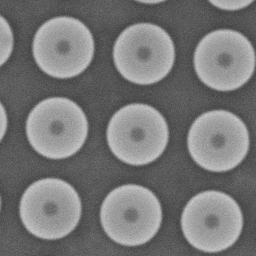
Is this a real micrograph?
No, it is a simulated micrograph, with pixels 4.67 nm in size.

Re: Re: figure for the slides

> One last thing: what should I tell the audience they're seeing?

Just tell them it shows an array of small figures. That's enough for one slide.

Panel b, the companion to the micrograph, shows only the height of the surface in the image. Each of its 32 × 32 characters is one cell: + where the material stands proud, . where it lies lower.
...........................++++.
................................
+.....++++......................
+....++++++.....++++............
++..+++++++....++++++.....++++..
++..++++++++..++++++++...++++++.
+...++++++++..++++++++..++++++++
+...+++++++...++++++++..++++++++
.....++++++....++++++...++++++++
.......++......++++++....++++++.
..........................++++..
................................
......+++.......................
....++++++.....++++.............
+...+++++++...++++++.....++++...
+..++++++++...+++++++...++++++..
+..++++++++..++++++++...+++++++.
....+++++++..++++++++...+++++++.
....++++++....+++++++...+++++++.
......+++......+++++....+++++++.
................++.......+++++..
................................
.....++.........................
....+++++......+++..............
...+++++++...++++++.....+++++...
...+++++++...+++++++...+++++++..
...+++++++...+++++++...+++++++..
...+++++++...+++++++...+++++++..
...++++++....+++++++...+++++++..
.....+++......+++++....+++++++..
...............+++......+++++...
................................